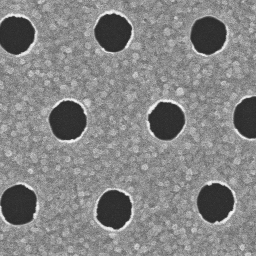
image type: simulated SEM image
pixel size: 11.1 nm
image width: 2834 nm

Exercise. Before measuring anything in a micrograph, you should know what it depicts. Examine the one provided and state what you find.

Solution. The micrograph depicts holes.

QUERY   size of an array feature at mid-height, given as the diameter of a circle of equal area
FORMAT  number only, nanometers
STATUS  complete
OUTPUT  413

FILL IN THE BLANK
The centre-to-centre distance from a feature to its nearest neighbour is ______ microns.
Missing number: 1.05